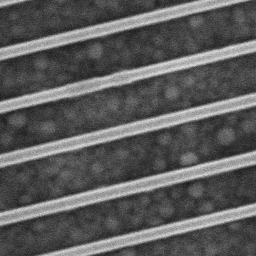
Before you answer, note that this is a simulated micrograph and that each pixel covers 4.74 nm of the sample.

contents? parallel lines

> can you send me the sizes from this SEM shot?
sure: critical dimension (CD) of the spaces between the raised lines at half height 0.199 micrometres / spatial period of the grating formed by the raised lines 251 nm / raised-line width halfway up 46.6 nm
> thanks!